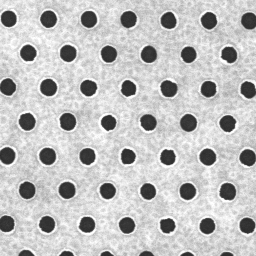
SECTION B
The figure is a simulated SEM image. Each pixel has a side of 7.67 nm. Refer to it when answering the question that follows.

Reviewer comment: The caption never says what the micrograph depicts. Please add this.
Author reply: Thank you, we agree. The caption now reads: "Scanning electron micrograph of a regular array of holes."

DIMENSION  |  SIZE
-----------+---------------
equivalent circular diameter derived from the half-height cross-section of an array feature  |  126 nm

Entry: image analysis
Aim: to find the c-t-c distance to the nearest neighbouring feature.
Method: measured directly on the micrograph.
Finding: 0.302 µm